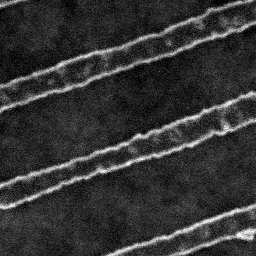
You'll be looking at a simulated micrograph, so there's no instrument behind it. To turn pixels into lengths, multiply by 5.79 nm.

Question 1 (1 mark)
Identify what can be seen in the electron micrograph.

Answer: one or a few lines or trenches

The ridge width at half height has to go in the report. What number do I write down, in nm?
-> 139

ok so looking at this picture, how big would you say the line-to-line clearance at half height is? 407 nanometres